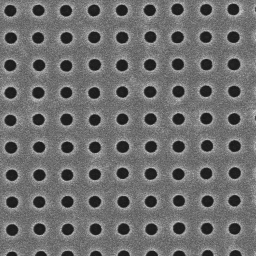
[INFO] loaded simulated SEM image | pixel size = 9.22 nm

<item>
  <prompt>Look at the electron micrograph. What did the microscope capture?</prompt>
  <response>a regular array of holes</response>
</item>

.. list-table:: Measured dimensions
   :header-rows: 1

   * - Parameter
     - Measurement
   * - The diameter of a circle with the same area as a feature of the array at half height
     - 113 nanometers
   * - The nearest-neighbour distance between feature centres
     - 0.25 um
